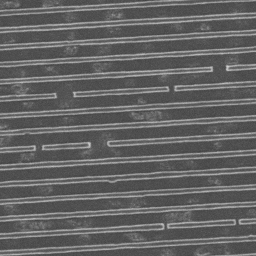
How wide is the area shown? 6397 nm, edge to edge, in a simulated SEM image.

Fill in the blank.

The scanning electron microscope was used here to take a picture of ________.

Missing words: parallel lines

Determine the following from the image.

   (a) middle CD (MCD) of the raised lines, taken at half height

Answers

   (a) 112 nm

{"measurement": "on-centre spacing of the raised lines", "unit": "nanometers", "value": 428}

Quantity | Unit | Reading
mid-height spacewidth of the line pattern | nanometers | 318